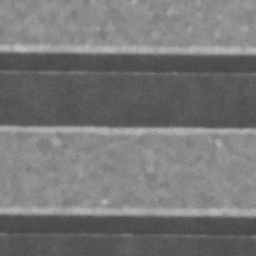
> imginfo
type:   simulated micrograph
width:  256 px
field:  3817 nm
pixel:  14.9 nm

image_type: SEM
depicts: lines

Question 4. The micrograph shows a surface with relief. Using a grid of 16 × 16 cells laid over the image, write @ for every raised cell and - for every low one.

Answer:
@@@@@@@@@@@@@@@@
@@@@@@@@@@@@@@@@
@@@@@@@@@@@@@@@@
----------------
----------------
----------------
----------------
----------------
@@@@@@@@@@@@@@@@
@@@@@@@@@@@@@@@@
@@@@@@@@@@@@@@@@
@@@@@@@@@@@@@@@@
@@@@@@@@@@@@@@@@
----------------
----------------
----------------